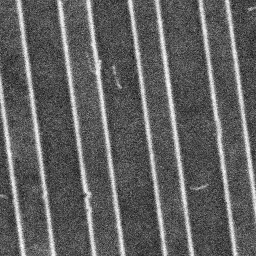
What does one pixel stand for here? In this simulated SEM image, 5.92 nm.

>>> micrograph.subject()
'one or a few lines or trenches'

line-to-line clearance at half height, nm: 243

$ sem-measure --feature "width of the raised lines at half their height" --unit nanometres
164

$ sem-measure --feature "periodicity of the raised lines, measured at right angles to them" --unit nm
411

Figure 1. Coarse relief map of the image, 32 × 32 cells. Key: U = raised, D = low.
UUDDDDDUUUUDDDDDUUUUDDDDDUUUUDDD
UUUDDDDDUUUDDDDDUUUUDDDDDUUUUDDD
UUUDDDDDUUUDDDDDDUUUDDDDDUUUUDDD
UUUDDDDDUUUDDDDDDUUUDDDDDUUUUDDD
UUUDDDDDUUUUDDDDDUUUDDDDDDUUUDDD
UUUDDDDDUUUUDDDDDUUUDDDDDDUUUDDD
UUUDDDDDUUUUDDDDDUUUUDDDDDUUUDDD
UUUDDDDDUUUUDDDDDUUUUDDDDDUUUUDD
UUUUDDDDDUUUDDDDDUUUUDDDDDUUUUDD
UUUUDDDDDUUUDDDDDDUUUDDDDDUUUUDD
UUUUDDDDDUUUDDDDDDUUUDDDDDUUUUDD
UUUUDDDDDUUUUDDDDDUUUDDDDDDUUUDD
UUUUDDDDDUUUUDDDDDUUUDDDDDDUUUDD
UUUUDDDDDUUUUDDDDDUUUUDDDDDUUUDD
UUUUDDDDDUUUUDDDDDUUUUDDDDDUUUDD
DUUUDDDDDDUUUDDDDDUUUUDDDDDUUUUD
DUUUUDDDDDUUUDDDDDUUUUDDDDDUUUUD
DUUUUDDDDDUUUDDDDDDUUUDDDDDUUUUD
DUUUUDDDDDUUUUDDDDDUUUDDDDDDUUUD
DUUUUDDDDDUUUUDDDDDUUUDDDDDDUUUD
DUUUUDDDDDUUUUDDDDDUUUUDDDDDUUUD
DUUUUDDDDDUUUUDDDDDUUUUDDDDDUUUD
DDUUUDDDDDUUUUDDDDDUUUUDDDDDUUUU
DDUUUUDDDDDUUUDDDDDUUUUDDDDDUUUU
DDUUUUDDDDDUUUDDDDDDUUUDDDDDUUUU
DDUUUUDDDDDUUUUDDDDDUUUDDDDDDUUU
DDUUUUDDDDDUUUUDDDDDUUUDDDDDDUUU
DDUUUUDDDDDUUUUDDDDDUUUDDDDDDUUU
DDUUUUDDDDDUUUUDDDDDUUUUDDDDDUUU
DDDUUUDDDDDUUUUDDDDDUUUUDDDDDUUU
DDDUUUUDDDDDUUUDDDDDUUUUDDDDDUUU
DDDUUUUDDDDDUUUDDDDDDUUUDDDDDUUU